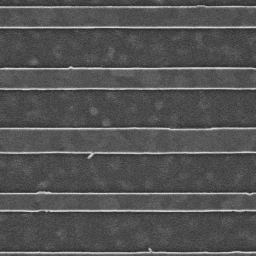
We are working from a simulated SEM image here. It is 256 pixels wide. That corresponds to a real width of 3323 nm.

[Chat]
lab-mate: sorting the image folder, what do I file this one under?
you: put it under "one or a few lines or trenches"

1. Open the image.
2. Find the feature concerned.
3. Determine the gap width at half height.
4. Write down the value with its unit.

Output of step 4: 521 nm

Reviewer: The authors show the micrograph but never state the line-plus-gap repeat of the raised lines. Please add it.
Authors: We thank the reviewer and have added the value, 61.7 pixels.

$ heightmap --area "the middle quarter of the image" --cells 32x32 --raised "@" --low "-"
--------------------------------
@@@@@@@@@@@@@@@@@@@@@@@@@@@@@@@@
@@@@@@@@@@@@@@@@@@@@@@@@@@@@@@@@
@@@@@@@@@@@@@@@@@@@@@@@@@@@@@@@@
@@@@@@@@@@@@@@@@@@@@@@@@@@@@@@@@
@@@@@@@@@@@@@@@@@@@@@@@@@@@@@@@@
--------------------------------
--------------------------------
--------------------------------
--------------------------------
--------------------------------
--------------------------------
--------------------------------
--------------------------------
--------------------------------
--------------------------------
@@@@@@@@@@@@@@@@@@@@@@@@@@@@@@@@
@@@@@@@@@@@@@@@@@@@@@@@@@@@@@@@@
@@@@@@@@@@@@@@@@@@@@@@@@@@@@@@@@
@@@@@@@@@@@@@@@@@@@@@@@@@@@@@@@@
@@@@@@@@@@@@@@@@@@@@@@@@@@@@@@@@
@@@@@@@@@@@@@@@@@@@@@@@@@@@@@@@@
-------@------------------------
--------------------------------
--------------------------------
--------------------------------
--------------------------------
--------------------------------
--------------------------------
--------------------------------
--------------------------------
--------------------------------